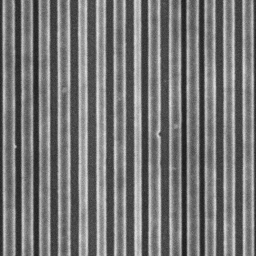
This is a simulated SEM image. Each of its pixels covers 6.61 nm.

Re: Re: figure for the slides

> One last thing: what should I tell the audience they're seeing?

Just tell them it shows parallel lines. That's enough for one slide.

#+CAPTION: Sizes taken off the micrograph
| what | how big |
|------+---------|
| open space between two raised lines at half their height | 57.8 nm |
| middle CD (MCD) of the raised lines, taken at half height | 70.2 nanometres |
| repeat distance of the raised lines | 122 nanometres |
